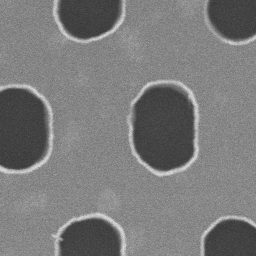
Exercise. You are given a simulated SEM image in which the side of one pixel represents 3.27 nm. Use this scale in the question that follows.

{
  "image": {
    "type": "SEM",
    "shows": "holes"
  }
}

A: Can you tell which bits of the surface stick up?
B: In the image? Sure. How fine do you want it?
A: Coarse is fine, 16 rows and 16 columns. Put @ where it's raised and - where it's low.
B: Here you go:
@@@@----@@@@@---
@@@@---@@@@@@---
@@@@@@@@@@@@@@-@
@@@@@@@@@@@@@@@@
@@@@@@@@@@@@@@@@
@@@@@@@@@--@@@@@
---@@@@@----@@@@
---@@@@@----@@@@
---@@@@@----@@@@
---@@@@@@---@@@@
--@@@@@@@@-@@@@@
@@@@@@@@@@@@@@@@
@@@@@@@@@@@@@@@@
@@@@@@@@@@@@@@@@
@@@@---@@@@@@---
@@@@----@@@@@---